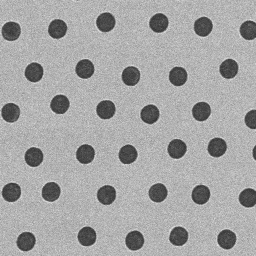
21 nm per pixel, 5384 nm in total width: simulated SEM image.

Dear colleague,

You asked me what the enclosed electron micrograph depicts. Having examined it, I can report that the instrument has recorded a regular array of holes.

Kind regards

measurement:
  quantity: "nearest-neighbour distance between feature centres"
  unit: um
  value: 0.895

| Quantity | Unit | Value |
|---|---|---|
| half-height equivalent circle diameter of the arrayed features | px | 19.6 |